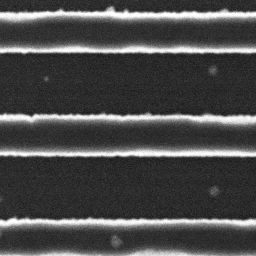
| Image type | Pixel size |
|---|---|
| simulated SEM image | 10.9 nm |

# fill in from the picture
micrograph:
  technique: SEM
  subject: lines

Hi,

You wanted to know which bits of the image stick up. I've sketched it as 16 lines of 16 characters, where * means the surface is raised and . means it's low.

................
****************
****************
................
................
................
................
****************
****************
****************
................
................
................
................
****************
****************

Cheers